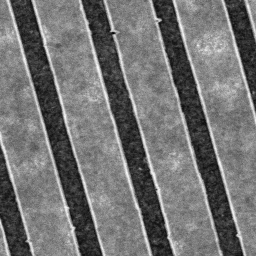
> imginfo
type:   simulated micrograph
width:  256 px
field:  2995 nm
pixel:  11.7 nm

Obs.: one or a few lines or trenches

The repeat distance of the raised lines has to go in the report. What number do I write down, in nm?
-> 802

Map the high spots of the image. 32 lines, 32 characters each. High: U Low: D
UDDDUUUUUUDDDUUUUUUDDDUUUUUUDDDU
UDDDDUUUUUDDDDUUUUUDDDUUUUUUDDDU
UUDDDUUUUUUDDDUUUUUUDDUUUUUUDDDD
UUDDDUUUUUUDDDUUUUUUDDDUUUUUUDDD
UUDDDUUUUUUDDDUUUUUUDDDUUUUUUDDD
UUUDDDUUUUUDDDDUUUUUDDDUUUUUUDDD
UUUDDDUUUUUUDDDUUUUUDDDUUUUUUUDD
UUUDDDUUUUUUDDDUUUUUUDDDUUUUUUDD
UUUDDDDUUUUUDDDUUUUUUDDDUUUUUUDD
UUUUDDDUUUUUUDDDUUUUUDDDUUUUUUDD
UUUUDDDUUUUUUDDDUUUUUUDDDUUUUUUD
UUUUDDDUUUUUUDDDUUUUUUDDDUUUUUUD
UUUUDDDDUUUUUDDDDUUUUUDDDUUUUUUD
UUUUUDDDUUUUUUDDDUUUUUDDDDUUUUUU
UUUUUDDDUUUUUUDDDUUUUUUDDDUUUUUU
UUUUUDDDUUUUUUDDDUUUUUUDDDUUUUUU
UUUUUUDDDUUUUUDDDDUUUUUDDDUUUUUU
UUUUUUDDDUUUUUUDDDUUUUUUDDDUUUUU
UUUUUUDDDUUUUUUDDDUUUUUUDDDUUUUU
DUUUUUDDDUUUUUUDDDDUUUUUDDDUUUUU
DUUUUUUDDDUUUUUUDDDUUUUUDDDDUUUU
DUUUUUUDDDUUUUUUDDDUUUUUUDDDUUUU
DDUUUUUDDDUUUUUUDDDUUUUUUDDDUUUU
DDUUUUUUDDDUUUUUDDDDUUUUUDDDUUUU
DDUUUUUUDDDUUUUUUDDDUUUUUUDDDUUU
DDUUUUUUDDDUUUUUUDDDUUUUUUDDDUUU
DDDUUUUUDDDDUUUUUDDDDUUUUUDDDUUU
DDDUUUUUUDDDUUUUUUDDDUUUUUDDDUUU
DDDUUUUUUDDDUUUUUUDDDUUUUUUDDDUU
DDDDUUUUUDDDUUUUUUDDDUUUUUUDDDUU
UDDDUUUUUDDDDUUUUUDDDUUUUUUDDDUU
UDDDUUUUUUDDDUUUUUUDDDUUUUUUDDDU